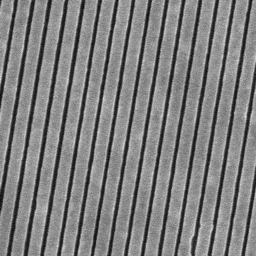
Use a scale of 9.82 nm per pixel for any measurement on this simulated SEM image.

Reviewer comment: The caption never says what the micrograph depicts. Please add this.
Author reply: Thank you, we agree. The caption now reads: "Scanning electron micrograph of parallel lines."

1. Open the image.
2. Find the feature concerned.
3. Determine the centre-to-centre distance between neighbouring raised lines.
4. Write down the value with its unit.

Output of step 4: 162 nanometres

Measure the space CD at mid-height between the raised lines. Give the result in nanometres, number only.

43.7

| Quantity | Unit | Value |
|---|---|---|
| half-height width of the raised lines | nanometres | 119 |